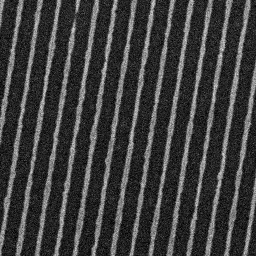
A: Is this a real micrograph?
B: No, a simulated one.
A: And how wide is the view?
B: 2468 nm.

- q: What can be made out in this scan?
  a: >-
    parallel lines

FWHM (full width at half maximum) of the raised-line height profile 35.7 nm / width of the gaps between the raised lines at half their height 145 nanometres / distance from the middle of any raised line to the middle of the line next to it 0.18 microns